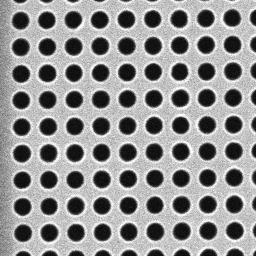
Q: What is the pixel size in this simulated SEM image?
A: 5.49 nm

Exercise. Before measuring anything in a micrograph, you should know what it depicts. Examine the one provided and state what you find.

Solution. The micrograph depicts a regular array of holes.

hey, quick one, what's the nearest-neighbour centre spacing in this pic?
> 144 nm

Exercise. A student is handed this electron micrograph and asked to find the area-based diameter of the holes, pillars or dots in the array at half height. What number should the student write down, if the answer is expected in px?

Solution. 17.1